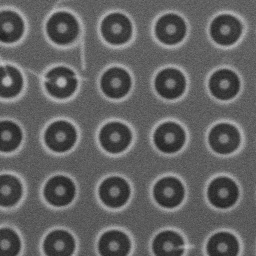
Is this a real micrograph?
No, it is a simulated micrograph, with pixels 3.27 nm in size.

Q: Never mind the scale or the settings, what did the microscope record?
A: an array of small figures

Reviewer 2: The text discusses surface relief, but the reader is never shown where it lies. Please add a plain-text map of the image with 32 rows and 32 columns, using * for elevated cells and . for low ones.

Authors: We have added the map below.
********************************
..*****..***********************
...***....***...****...****...**
...***....**.....**....***....**
...***....***....**....***....**
*******..*****..****..*****..***
********************************
********************************
..****...*****.******.**********
...***...****...***....***....**
...**.....***...***....***....**
...***...****...****...***....**
***************************..***
********************************
********************************
..****...****...****..*****..***
...**.....**.....**....***....**
...**.....**.....**....***....**
..****...****...****...***....**
********************************
********************************
********************************
...***...****...****..*****..***
...**....***....***....***....**
...**....***....***....***....**
..****...****...****...***...***
********************************
********************************
.*******************************
..****...****...***....****..***
...**....***....***....***....**
...**....***....***....***....**